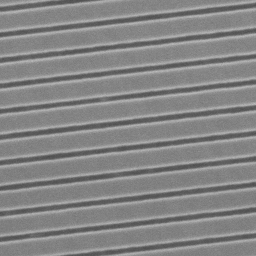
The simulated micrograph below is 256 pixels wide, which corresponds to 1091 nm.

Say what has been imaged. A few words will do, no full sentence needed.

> parallel lines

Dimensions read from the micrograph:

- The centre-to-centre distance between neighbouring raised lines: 25.4 pixels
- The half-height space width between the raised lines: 0.0243 microns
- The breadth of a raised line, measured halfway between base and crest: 84.2 nanometers